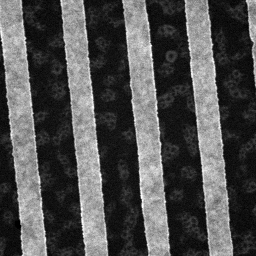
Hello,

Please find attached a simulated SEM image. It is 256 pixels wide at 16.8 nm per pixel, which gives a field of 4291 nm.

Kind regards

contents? one or a few lines or trenches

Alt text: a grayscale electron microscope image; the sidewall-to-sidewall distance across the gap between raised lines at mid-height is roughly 0.669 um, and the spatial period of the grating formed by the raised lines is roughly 1030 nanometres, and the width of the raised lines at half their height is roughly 0.373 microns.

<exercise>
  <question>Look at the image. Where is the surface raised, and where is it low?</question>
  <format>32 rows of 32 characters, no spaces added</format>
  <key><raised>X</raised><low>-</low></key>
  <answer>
XXX-----XX-----XXX-----XXX-----X
XXX-----XXX-----XX-----XXX-----X
XXX-----XXX-----XX-----XXX-----X
XXX-----XXX-----XXX--X-XXX-----X
XXX-----XXX-----XXX-----XX-----X
XXX-----XXX-----XXX-----XX------
XXX-----XXX-----XXX--X--XXX----X
-XX-----XXX-----XXX--X--XXX-----
-XX-----XXX-----XXX-----XXX-----
-XXX-----XX-----XXX-----XXX-----
-XXX-----XX-----XXX-----XXX-----
-XXX-----XXX-----XX-----XXX-----
-XXX-----XXX-----XXX----XXX-----
-XXX-----XXX-----XXX----XXX-----
-XXX-----XXX-----XXX-----XX-----
-XXX-----XXX-----XXX-----XX-----
-XXX-----XXX-----XXX-----XXX----
--XX-----XXX-----XXX-----XXX----
--XX-----XXX-----XXX-----XXX----
--XXX-----XX-----XXX-----XXX----
--XXX-----XX-----XXX-----XXX----
--XXX-----XXX----XXX-----XXX----
--XXX-----XXX-----XX-----XXX----
--XXX-----XXX-----XX-----XXX----
--XXX-----XXX-----XXX-----XX----
--XXX-----XXX-----XXX-----XX----
--XXX-----XXX-----XXX-----XXX---
---XX-----XXX-----XXX---X-XXX---
---XX-----XXX-----XXX-----XXX---
---XXX----XXX-----XXX-----XXX---
---XXX-----XX-----XXX-----XXX---
---XXX-----XX------XX-----XXX---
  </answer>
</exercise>